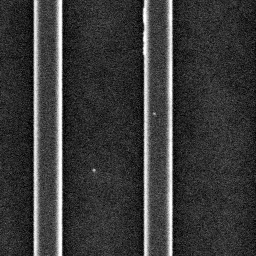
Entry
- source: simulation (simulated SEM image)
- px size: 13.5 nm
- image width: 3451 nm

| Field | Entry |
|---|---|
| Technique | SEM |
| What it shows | lines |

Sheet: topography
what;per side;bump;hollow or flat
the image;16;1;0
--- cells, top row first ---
0011000001100000
0011000001100000
0011000001100000
0011000001100000
0011000001100000
0011000001100000
0011000001100000
0011000001100000
0011000001100000
0011000001100000
0011000001100000
0011000001100000
0011000001100000
0011000001100000
0011000001100000
0011000001100000